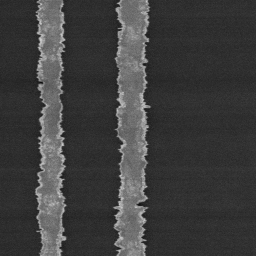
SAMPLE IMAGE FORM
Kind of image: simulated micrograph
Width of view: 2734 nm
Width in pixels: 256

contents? one or a few lines or trenches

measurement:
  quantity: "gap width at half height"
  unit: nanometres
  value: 609